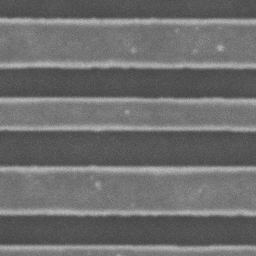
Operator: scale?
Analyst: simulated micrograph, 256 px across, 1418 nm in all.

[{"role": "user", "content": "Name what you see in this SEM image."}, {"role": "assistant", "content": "lines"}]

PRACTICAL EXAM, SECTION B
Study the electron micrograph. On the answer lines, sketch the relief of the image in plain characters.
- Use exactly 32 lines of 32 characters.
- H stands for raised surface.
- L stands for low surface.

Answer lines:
LLLLLLLLLLLLLLLLLLLLLLLLLLLLLLLL
LLLLLLLLLLLLLLLLLLLLLLLLLLLLLLLL
HHHHHHHHHLHHLLHLHHHHHHLLLLHLLLLL
HHHHHHHHHHHHHHHHHHHHHHHHHHHHHHHH
HHHHHHHHHHHHHHHHHHHHHHHHHHHHHHHH
HHHHHHHHHHHHHHHHHHHHHHHHHHHHHHHH
HHHHHHHHHHHHHHHHHHHHHHHHHHHHHHHH
HHHHHHHHHHHHHHHHHHHHHHHHHHHHHHHH
LLLLLLLLLLLLLLLLLLLLLLLLLLLLLLLL
LLLLLLLLLLLLLLLLLLLLLLLLLLLLLLLL
LLLLLLLLLLLLLLLLLLLLLLLLLLLLLLLL
LLLLLLLLLLLLLLLLLLLLLLLLLLLLLLLL
HHHHHHHHHHHHHHHHHHHHHHHHHHHHHHHH
HHHHHHHHHHHHHHHHHHHHHHHHHHHHHHHH
HHHHHHHHHHHHHHHHHHHHHHHHHHHHHHHH
HHHHHHHHHHHHHHHHHHHHHHHHHHHHHHHH
LLLLLLLLLLLLLLLLLLLLLLLLLLLLLLLL
LLLLLLLLLLLLLLLLLLLLLLLLLLLLLLLL
LLLLLLLLLLLLLLLLLLLLLLLLLLLLLLLL
LLLLLLLLLLLLLLLLLLLLLLLLLLLLLLLL
LLLLLLLLLLLLLLLLLLLLLLLLLLLLLLLL
HHHHHHHHHHHHHHHHHHHHHHHHHHHHHHHH
HHHHHHHHHHHHHHHHHHHHHHHHHHHHHHHH
HHHHHHHHHHHHHHHHHHHHHHHHHHHHHHHH
HHHHHHHHHHHHHHHHHHHHHHHHHHHHHHHH
HHHHHHHHHHHHHHHHHHHHHHHHHHHHHHHH
HHHHHHHHHHHHHHHHHHHHHHHHHHHHHHHH
LLLLLLLLLLLLLLLLLLLLLLLLLLLLLLLL
LLLLLLLLLLLLLLLLLLLLLLLLLLLLLLLL
LLLLLLLLLLLLLLLLLLLLLLLLLLLLLLLL
LLLLLLLLLLLLLLLLLLLLLLLLLLLLLLLL
HHHHHHHHHHHHHHHHHHHHHHHHHHHHHHHH